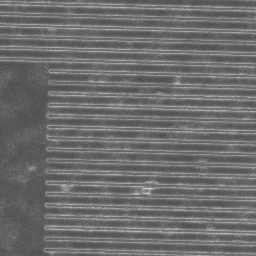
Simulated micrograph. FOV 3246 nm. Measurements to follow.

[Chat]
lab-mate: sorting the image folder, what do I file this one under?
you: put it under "parallel lines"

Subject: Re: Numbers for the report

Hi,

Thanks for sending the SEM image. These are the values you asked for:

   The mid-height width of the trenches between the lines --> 30.1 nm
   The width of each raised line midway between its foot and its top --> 114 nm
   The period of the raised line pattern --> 0.142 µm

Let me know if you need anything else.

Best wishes